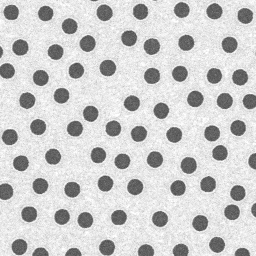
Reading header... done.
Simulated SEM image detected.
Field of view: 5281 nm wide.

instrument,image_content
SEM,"a regular array of holes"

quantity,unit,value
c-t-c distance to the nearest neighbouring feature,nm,567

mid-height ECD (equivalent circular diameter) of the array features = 341 nm